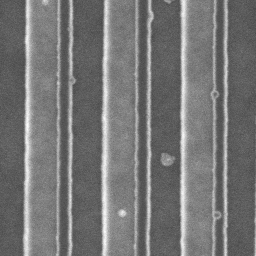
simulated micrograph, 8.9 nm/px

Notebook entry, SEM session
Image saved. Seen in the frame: lines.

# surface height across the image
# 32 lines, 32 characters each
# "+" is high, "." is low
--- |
...++++++....++++++....+++++....
...++++++....++++++....+++++....
...++++++....++++++....+++++....
...++++++....++++++....+++++....
...++++++....++++++....+++++....
...++++++....++++++....+++++....
...++++++....++++++....+++++....
...++++++....++++++....+++++....
...++++++....++++++....+++++....
...++++++....++++++....+++++....
...++++++....++++++....+++++....
...++++++....++++++....+++++....
...++++++....++++++....+++++....
...++++++....++++++....+++++....
...++++++....++++++....+++++....
...++++++....++++++....+++++....
...++++++....++++++....+++++....
...++++++....++++++....+++++....
...++++++....++++++....+++++....
...++++++....++++++....+++++....
...++++++....++++++....+++++....
...++++++....++++++....+++++....
...++++++....++++++....+++++....
...++++++....++++++....+++++....
...++++++....+++++.....+++++....
...++++++....++++++....+++++....
...++++++....++++++....+++++....
...++++++....++++++....+++++....
...++++++....+++++.....+++++....
...++++++....+++++.....+++++....
...++++++....+++++.....+++++....
...++++++....+++++.....+++++....